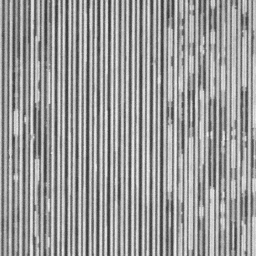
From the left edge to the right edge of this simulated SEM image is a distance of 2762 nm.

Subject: parallel lines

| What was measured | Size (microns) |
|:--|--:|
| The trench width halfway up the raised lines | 0.031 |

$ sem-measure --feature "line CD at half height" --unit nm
21.6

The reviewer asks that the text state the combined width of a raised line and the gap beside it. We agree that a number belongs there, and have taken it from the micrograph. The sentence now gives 0.0572 micrometres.